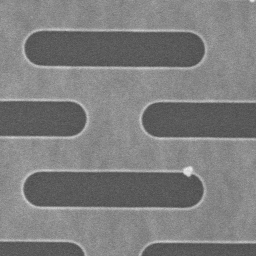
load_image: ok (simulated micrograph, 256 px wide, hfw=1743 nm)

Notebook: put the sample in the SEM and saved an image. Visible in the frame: groups of lines, slits or small figures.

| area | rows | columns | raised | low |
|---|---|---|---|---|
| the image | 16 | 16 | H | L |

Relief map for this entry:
HHHHHHHHHHHHHHHH
HHHHHHHHHHHHHHHH
HHLLLLLLLLLLLHHH
HHLLLLLLLLLLLHHH
HHHHHHHHHHHHHHHH
HHHHHHHHHHHHHHHH
LLLLLHHHHHLLLLLL
LLLLLHHHHLLLLLLL
LLLLLHHHHHLLLLLL
HHHHHHHHHHHHHHHH
HHHHHHHHHHHHHHHH
HHLLLLLLLLLLLHHH
HHLLLLLLLLLLHHHH
HHHHHHHHHHHHHHHH
HHHHHHHHHHHHHHHH
LLLLLHHHHLLLLLLL